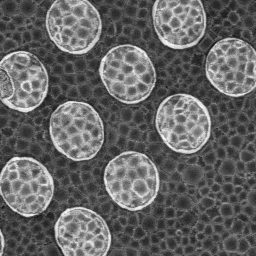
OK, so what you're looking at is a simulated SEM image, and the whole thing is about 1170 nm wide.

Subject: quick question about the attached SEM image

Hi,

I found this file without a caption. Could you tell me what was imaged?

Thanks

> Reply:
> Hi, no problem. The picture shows raised bodies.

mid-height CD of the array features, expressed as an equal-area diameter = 254 nm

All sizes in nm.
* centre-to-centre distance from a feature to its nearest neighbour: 339